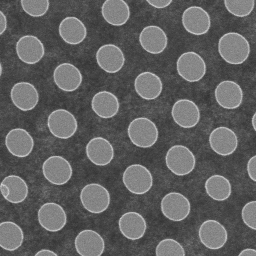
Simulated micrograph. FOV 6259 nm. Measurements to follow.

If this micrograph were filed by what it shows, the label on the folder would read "a regular array of raised bodies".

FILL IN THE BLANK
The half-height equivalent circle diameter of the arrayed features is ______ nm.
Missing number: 665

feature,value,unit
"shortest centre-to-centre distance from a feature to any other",1.14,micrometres